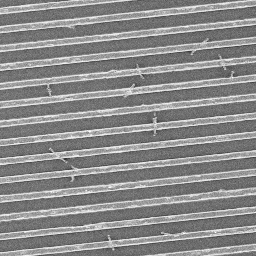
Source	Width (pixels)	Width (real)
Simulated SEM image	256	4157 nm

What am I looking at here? parallel lines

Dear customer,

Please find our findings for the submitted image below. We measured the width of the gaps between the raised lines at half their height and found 208 nm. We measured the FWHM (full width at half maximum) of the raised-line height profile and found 96.9 nanometers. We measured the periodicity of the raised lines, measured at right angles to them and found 304 nanometres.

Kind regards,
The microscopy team